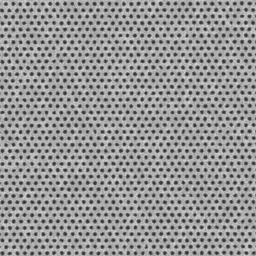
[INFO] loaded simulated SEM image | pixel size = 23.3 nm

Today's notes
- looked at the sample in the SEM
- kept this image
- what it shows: a regular array of holes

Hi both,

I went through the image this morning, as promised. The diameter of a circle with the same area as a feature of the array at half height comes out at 94.9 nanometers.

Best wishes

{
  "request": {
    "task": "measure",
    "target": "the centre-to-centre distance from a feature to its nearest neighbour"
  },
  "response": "163 nm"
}